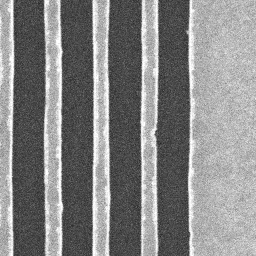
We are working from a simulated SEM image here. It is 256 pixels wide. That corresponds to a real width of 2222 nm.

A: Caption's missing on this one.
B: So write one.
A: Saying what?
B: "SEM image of parallel lines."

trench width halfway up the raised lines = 298 nm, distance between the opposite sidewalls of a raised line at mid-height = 122 nm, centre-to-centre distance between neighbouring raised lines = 417 nm